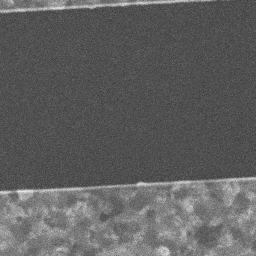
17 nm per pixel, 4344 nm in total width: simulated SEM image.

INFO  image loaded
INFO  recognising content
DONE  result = one or a few lines or trenches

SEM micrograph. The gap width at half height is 3070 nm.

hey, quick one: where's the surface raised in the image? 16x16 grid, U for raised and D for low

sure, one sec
UUUUDDDDDDDDDDDD
DDDDDDDDDDDDDDDD
DDDDDDDDDDDDDDDD
DDDDDDDDDDDDDDDD
DDDDDDDDDDDDDDDD
DDDDDDDDDDDDDDDD
DDDDDDDDDDDDDDDD
DDDDDDDDDDDDDDDD
DDDDDDDDDDDDDDDD
DDDDDDDDDDDDDDDD
DDDDDDDDDDDDDDDD
DDDDDDDDDUUUUUUU
UUUUUUUUUUUUUUUU
UUUUUUUUUUUUUUUU
UUUUUUUUUUUUUUUU
UUUUUUUUUUUUUUUU